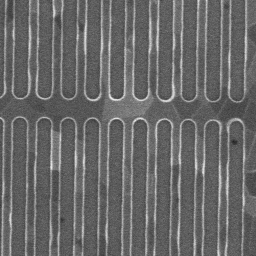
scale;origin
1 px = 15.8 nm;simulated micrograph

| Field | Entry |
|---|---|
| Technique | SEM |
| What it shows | groups of lines, slits or small figures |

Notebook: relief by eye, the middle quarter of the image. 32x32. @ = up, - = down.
---@@----@@----@@----@@----@@---
---@@----@@----@@----@@----@@---
---@@----@@----@@----@@----@@---
---@@----@@----@@----@@----@@---
---@@----@@----@@----@@----@@---
---@@----@@----@@----@@----@@---
---@@----@@----@@----@@----@@---
---@@----@@----@@----@@----@@---
--@@@@--@@@@--@@@@--@@@@---@@@--
@@@@@@@@@@@@@@@@@@@@@@@@@@@@@@@@
@@@@@@@@@@@@@@@@@@@@@@@@@@@@@@@@
@@@@@@@@@@@@@@@@@@@@@@@@@@@@@@@@
@@@@@@@@@@@@@@@@@@@@@@@@@@@@@@@@
@-@@@@@@@@@@@@@@@@@@@@@@@@@@@@@@
---@@@---@@@---@@@--@@@@--@@@@--
---@@----@@----@@----@@----@@---
---@@----@@----@@----@@----@@---
---@@----@@----@@----@@----@@---
---@@----@@----@@----@@----@@---
---@@----@@----@@----@@----@@---
---@@----@@----@@----@@----@@---
---@@----@@----@@----@@----@@---
---@@----@@----@@----@@----@@---
---@@----@@----@@----@@----@@---
---@@----@@----@@----@@----@@---
---@@----@@----@@----@@----@@---
---@@----@@----@@----@@----@@---
---@@----@@----@@----@@----@@---
---@@----@@----@@----@@----@@---
---@@----@@----@@----@@----@@---
---@@----@@----@@----@@----@@---
---@@----@@----@@----@@----@@---